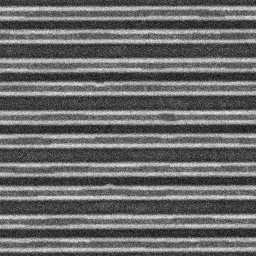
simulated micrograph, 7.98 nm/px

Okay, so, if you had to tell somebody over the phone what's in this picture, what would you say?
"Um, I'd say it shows parallel lines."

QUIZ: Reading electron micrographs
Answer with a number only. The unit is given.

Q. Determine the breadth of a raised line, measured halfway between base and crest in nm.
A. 82.8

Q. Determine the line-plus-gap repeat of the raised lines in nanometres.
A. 205